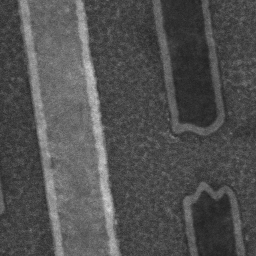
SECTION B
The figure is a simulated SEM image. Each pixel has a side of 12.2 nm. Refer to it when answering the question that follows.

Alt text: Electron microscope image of one or a few lines or trenches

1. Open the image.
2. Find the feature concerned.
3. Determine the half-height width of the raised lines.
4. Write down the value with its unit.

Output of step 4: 666 nanometers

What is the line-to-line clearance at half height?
936 nm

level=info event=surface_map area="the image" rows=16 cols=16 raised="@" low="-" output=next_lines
-@@@@-----@@@---
--@@@-----@@@---
--@@@-----@@@---
--@@@-----@@@---
--@@@@----@@@---
--@@@@-----@@@--
--@@@@-----@@@--
--@@@@-----@@@--
---@@@----------
---@@@----------
---@@@----------
---@@@@---------
---@@@@-----@@@-
---@@@@-----@@@-
----@@@-----@@@-
----@@@-----@@@-